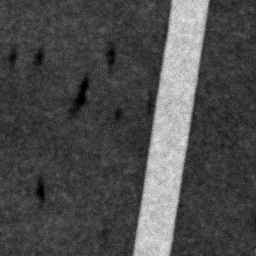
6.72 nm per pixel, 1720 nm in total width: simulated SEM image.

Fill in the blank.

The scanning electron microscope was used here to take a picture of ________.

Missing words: one or a few lines or trenches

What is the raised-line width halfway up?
0.241 µm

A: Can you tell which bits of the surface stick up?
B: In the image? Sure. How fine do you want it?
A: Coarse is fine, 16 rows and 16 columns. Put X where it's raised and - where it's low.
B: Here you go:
-----------XX---
-----------XX---
----------XXX---
----------XXX---
----------XX----
----------XX----
----------XX----
----------XX----
---------XXX----
---------XXX----
---------XX-----
---------XX-----
---------XX-----
---------XX-----
---------XX-----
--------XXX-----